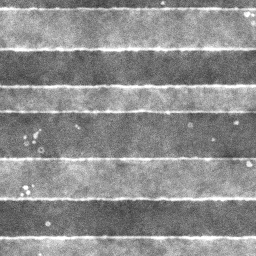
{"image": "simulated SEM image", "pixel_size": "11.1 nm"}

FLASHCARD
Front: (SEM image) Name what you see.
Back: lines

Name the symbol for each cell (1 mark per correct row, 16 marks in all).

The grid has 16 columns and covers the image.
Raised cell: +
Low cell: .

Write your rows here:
................
++++++++++++++++
++++++++++++++++
................
................
++++++++++++++++
++++++++++++++++
................
................
................
++++++++++++++++
++++++++++++++++
................
................
................
++++++++++++++++